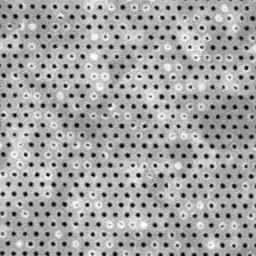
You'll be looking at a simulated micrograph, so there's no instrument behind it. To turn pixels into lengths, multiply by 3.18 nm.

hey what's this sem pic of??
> a regular array of holes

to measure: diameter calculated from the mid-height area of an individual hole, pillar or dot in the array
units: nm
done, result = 15.2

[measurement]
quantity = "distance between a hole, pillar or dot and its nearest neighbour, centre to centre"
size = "35.1 nm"